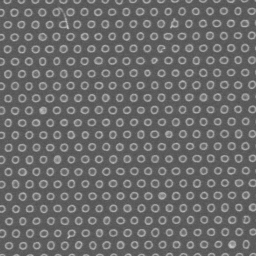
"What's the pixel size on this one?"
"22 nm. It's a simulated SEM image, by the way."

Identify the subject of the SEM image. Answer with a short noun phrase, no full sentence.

a regular array of raised bodies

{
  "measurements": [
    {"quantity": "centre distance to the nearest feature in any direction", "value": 302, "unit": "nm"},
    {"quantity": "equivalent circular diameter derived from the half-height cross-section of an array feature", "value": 7.31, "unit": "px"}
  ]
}